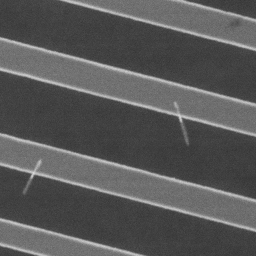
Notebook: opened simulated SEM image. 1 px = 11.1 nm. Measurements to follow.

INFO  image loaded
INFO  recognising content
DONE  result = lines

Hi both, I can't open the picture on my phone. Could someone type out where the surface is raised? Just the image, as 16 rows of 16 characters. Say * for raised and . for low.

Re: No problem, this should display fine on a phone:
......*******...
.........*******
*............***
****............
********........
....********....
........********
............****
*...............
****............
.*******........
....********....
........********
............****
***.............
.******.........